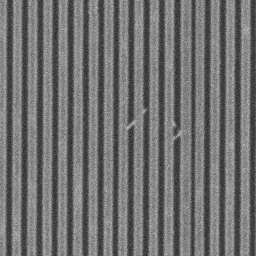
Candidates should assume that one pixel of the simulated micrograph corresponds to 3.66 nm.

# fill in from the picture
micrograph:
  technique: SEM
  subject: parallel lines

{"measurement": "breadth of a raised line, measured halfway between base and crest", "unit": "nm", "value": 27.9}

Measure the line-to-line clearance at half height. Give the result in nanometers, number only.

27.5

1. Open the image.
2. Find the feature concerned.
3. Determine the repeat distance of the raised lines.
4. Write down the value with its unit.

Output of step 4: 0.0558 micrometres